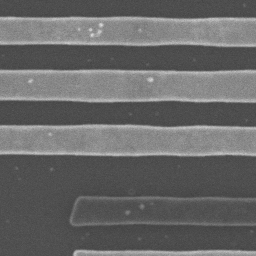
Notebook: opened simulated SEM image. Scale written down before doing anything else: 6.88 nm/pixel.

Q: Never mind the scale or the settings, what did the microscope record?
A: wiring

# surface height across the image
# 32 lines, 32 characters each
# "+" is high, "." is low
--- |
................................
................................
++++++++++++++++++++++++++++++++
++++++++++++++++++++++++++++++++
++++++++++++++++++++++++++++++++
++++....++++++++++++++++++++++++
................................
................................
................................
++++++++++++++++++++++++++++++++
++++++++++++++++++++++++++++++++
++++++++++++++++++++++++++++++++
.........+++++++++++..++++++++++
................................
................................
................................
++++++++++++++++++++++++++++++++
++++++++++++++++++++++++++++++++
++++++++++++++++++++++++++++++++
................................
................................
................................
................................
................................
................................
.........+++++++++++++++++++++++
.........+++++++++++++++++++++++
.........+++++++++++++++++++++++
................................
................................
................................
.........+++++++++++++++++++++++